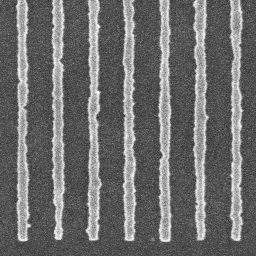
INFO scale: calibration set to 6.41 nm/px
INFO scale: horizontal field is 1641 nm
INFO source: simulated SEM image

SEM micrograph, parallel lines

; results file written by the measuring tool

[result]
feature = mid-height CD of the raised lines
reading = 53.7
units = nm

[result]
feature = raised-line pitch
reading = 228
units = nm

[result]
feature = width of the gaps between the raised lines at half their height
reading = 0.172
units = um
